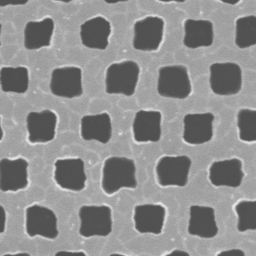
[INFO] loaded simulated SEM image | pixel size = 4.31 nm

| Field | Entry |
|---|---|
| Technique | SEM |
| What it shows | a regular array of holes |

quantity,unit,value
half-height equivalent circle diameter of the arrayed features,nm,138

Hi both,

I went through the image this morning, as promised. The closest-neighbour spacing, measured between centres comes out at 220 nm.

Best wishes